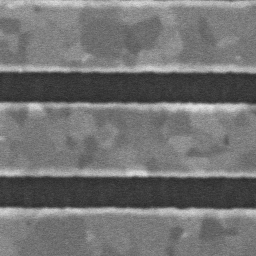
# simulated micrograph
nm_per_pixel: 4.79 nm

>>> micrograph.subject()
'lines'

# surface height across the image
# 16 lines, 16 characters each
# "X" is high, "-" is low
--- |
XXXXXXXXXXXXXXXX
XXXXXXXXXXXXXXXX
XXXXXXXXXXXXXXXX
XXXXXXXXXXXXXXXX
----------------
----------------
---X-X----------
XXXXXXXXXXXXXXXX
XXXXXXXXXXXXXXXX
XXXXXXXXXXXXXXXX
XXXXXXXXXXXXXXXX
----------------
----------------
XXXXXXXXXXXXXXXX
XXXXXXXXXXXXXXXX
XXXXXXXXXXXXXXXX